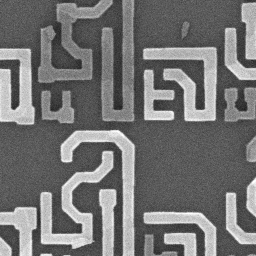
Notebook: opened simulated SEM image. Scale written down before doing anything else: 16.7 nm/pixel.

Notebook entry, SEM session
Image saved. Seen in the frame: wiring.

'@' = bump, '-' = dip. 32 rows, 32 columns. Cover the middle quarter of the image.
-----@@---@@---@@---------------
@@@@@@@---@@---@@--------@@@@---
@@@@@@@---@@---@@---@@---@@@@@--
@@@@@@@---@@---@@---@@---@@@@@@-
----------@@---@@---@@------@@@@
----------@@---@@---@@-------@@@
----------@@---@@---@@@-------@@
@---------@@---@@---@@@@@@@---@@
@---------@@---@@---@@@@@@@---@@
@---------@@---@@---@@--------@@
@@--------@@---@@---@@--------@@
@@--------@@@-@@@---@@--------@@
@@--------@@@@@@@---@@@@@@@---@@
@@--------@@@@@@@---@@@@@@@---@@
--------------------------------
--------------------------------
--------------------------------
--@@@@@@@@@@@@@-----------------
-@@@@@@@@@@@@@@@----------------
@@@@@-------@@@@@---------------
@@@-----------@@@---------------
@@------------@@@---------------
@@--------@@---@@---------------
@@--------@@---@@---------------
----------@@---@@---------------
---------@@@---@@---------------
--------@@@@---@@---------------
---@@@@@@@@----@@---------------
--@@@@@@@@-----@@---------------
-@@@@-@@-------@@---------------
@@@------------@@---------------
@@-------@@@@--@@---------------